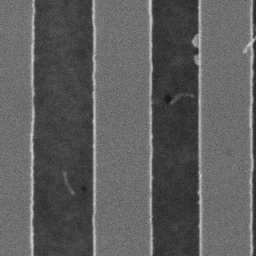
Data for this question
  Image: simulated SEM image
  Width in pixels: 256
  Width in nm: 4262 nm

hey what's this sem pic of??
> lines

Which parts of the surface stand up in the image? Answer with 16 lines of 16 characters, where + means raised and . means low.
++....+++...++++
++....+++...++++
++....+++...++++
++....+++...++++
++....+++...++++
++....+++...++++
++....+++...++++
++....+++...++++
++....+++...++++
++....+++...++++
++....+++...++++
++....+++....+++
++....+++....+++
++....+++....+++
++....+++....+++
++....+++....+++